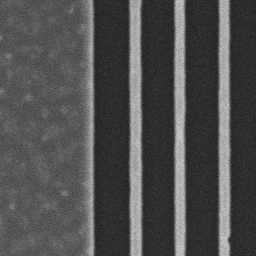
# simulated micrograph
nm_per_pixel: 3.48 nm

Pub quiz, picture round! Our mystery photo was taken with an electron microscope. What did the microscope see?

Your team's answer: parallel lines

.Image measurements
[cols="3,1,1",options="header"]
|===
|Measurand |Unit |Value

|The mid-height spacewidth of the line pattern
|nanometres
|121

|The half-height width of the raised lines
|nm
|35.3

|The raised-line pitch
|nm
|155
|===